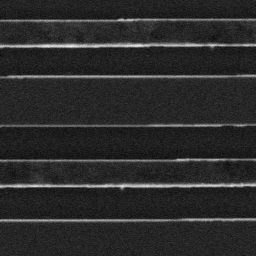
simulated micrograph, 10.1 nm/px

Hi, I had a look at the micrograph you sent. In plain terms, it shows lines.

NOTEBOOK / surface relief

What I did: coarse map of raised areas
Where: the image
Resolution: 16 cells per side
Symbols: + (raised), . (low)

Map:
................
++++++++++++++++
++++++++++++++++
................
................
++++++++++++++++
++++++++++++++++
++++++++++++++++
................
................
++++++++++++++++
++++++++++++++++
................
................
++++++++++++++++
++++++++++++++++